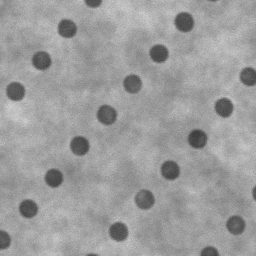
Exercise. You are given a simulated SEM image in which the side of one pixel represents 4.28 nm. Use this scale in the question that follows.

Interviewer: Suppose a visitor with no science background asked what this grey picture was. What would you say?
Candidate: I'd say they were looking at a regular array of holes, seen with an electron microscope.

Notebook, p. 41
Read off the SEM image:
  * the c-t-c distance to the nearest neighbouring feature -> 173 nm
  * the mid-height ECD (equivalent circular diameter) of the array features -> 20.6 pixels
